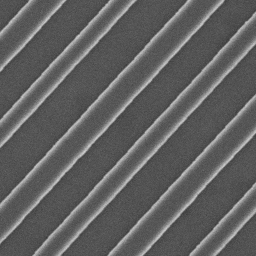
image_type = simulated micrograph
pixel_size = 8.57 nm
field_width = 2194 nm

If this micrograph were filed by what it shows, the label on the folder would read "lines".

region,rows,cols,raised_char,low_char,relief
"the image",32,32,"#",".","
...#####.....####......#####....
..#####.....####......#####.....
.#####.....####......#####.....#
.####......###......#####.....##
####......###......#####.....###
###......###......#####.....####
##......###.......####.....####.
#......###.......####......###..
......###.......####......###...
.....###.......####......###....
....###.......####......###.....
...###.......#####.....###......
..###.......#####.....###......#
.####......#####.....###......##
.###......#####.....####......##
###......#####.....####......###
##......#####.....####......####
#......#####.....####......####.
.......####.....####......####..
......####.....####......####...
.....####......###......####....
....####......###......####.....
...####......###......####......
..####......###......#####.....#
.#####.....###......#####......#
#####.....###......#####......##
####.....####.....#####......###
###.....####.....#####......###.
##.....####......####......###..
#.....####......####......###...
.....####......####......###....
....####......####......###.....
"